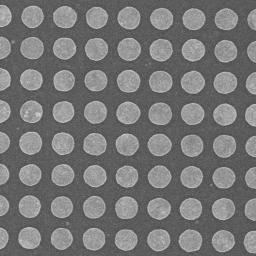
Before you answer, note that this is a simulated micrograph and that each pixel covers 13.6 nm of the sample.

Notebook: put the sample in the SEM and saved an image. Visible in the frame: a regular array of raised bodies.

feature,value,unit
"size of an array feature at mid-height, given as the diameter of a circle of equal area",0.3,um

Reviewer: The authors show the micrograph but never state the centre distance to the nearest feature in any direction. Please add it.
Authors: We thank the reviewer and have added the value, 0.427 micrometres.